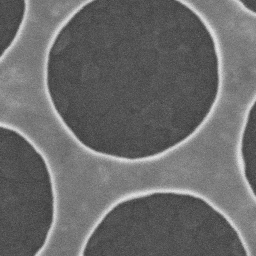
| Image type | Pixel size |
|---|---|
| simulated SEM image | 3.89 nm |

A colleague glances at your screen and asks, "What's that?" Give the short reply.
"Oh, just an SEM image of holes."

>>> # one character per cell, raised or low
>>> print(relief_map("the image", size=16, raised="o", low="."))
..ooo.......ooo.
.ooo.........ooo
.oo..........ooo
ooo...........oo
ooo...........oo
ooo...........oo
ooo..........ooo
oooo.........oo.
.oooo.......ooo.
..oooo....ooooo.
...oooooooooooo.
...ooooooooooooo
...ooooo.....ooo
...oooo.......oo
...ooo.........o
...oo..........o